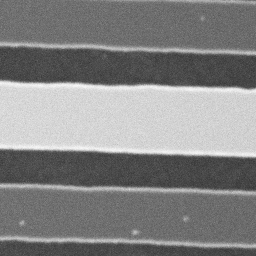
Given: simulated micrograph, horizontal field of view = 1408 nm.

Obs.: lines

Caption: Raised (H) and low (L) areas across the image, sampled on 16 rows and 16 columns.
HHHHHHHHHHHHHHHH
HHHHHHHHHHHHHHHH
HHHHHHHHHHHHHHHH
LLLLLLLLLLLLLLLL
LLLLLLLLLLLLLLLL
HHHHHHHHHHHHHLLL
HHHHHHHHHHHHHHHH
HHHHHHHHHHHHHHHH
HHHHHHHHHHHHHHHH
LLLLLLLLHHHHHHHH
LLLLLLLLLLLLLLLL
LLLLLLLLLLLLLLLL
HHHHHHHHHHHHHHHH
HHHHHHHHHHHHHHHH
HHHHHHHHHHHHHHHH
LLLLLLLLLLLLLLLL